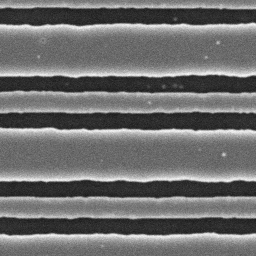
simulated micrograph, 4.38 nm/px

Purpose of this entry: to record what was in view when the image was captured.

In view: lines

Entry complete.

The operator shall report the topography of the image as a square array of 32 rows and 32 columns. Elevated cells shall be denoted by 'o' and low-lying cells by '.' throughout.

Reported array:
oooooooooooooooooooooooooooooooo
................................
................................
oooooooooooooooooooooooooooooooo
oooooooooooooooooooooooooooooooo
oooooooooooooooooooooooooooooooo
oooooooooooooooooooooooooooooooo
oooooooooooooooooooooooooooooooo
oooooooooooooooooooooooooooooooo
........oo........oooo.......oo.
................................
................................
oooooooooooooooooooooooooooooooo
oooooooooooooooooooooooooooooooo
................................
................................
oooooooooooooooooooooooooooooooo
oooooooooooooooooooooooooooooooo
oooooooooooooooooooooooooooooooo
oooooooooooooooooooooooooooooooo
oooooooooooooooooooooooooooooooo
oooooooooooooooooooooooooooooooo
oooooooooooooooooooooooooooooooo
................................
................................
oooooooooooooooooooooooooooooooo
oooooooooooooooooooooooooooooooo
................................
................................
oooooooooooooooooooooooooooooooo
oooooooooooooooooooooooooooooooo
oooooooooooooooooooooooooooooooo